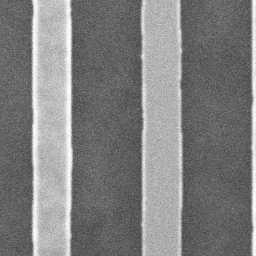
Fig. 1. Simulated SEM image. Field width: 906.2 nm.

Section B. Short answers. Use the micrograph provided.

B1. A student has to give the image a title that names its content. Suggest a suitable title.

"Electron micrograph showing lines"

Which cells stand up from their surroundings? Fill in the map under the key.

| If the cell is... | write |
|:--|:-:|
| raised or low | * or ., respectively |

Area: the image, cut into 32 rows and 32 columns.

....*****.........****..........
....*****.........****..........
....*****.........****..........
....*****.........*****.........
....*****.........*****.........
....*****.........*****.........
....*****.........*****.........
....*****.........*****.........
....*****.........*****.........
....*****.........*****.........
....*****.........****..........
....*****.........*****.........
....*****.........*****.........
....*****.........*****.........
....*****.........*****.........
....*****.........*****.........
....*****.........*****.........
....*****.........*****.........
....*****.........*****.........
....*****.........*****.........
....*****.........*****.........
....*****.........*****.........
....*****.........*****.........
....*****.........*****.........
....*****.........*****.........
....*****.........*****.........
....*****.........*****.........
....*****.........*****.........
....*****.........*****.........
....*****.........*****.........
....*****.........*****.........
....*****.........*****.........